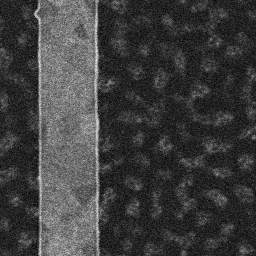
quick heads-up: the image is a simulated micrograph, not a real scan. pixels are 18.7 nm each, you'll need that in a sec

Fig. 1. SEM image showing one or a few lines or trenches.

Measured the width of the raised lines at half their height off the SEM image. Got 1060 nanometres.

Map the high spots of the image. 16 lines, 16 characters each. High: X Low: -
--XXXX----------
--XXXX----------
--XXXX----------
--XXXX----------
---XXX----------
---XXX----------
---XXX----------
---XXX----------
---XXX----------
---XXX----------
---XXX----------
--XXXX----------
---XXX----------
---XXX----------
--XXXX----------
--XXXX----------